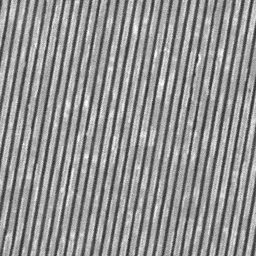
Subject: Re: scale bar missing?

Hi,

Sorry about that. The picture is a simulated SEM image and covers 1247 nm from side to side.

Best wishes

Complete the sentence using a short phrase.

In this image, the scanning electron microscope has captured parallel lines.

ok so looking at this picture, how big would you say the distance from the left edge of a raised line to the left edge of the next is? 43 nanometres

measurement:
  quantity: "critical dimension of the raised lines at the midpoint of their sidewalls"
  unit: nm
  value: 23.4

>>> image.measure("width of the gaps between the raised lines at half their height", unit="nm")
18.5